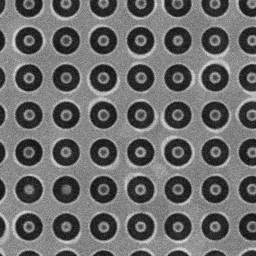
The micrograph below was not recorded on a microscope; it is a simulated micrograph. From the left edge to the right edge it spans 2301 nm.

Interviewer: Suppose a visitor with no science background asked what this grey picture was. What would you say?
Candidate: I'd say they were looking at an array of small figures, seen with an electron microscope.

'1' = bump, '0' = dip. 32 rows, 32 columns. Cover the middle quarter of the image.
00011111000011111000011111100011
00001110000001110000001111000001
10001100011001110001000110001000
11001100011000110011000110011100
10001100011000110000000110001000
00001110000001110000001111000001
00011111000011111000011111100011
11111111111111111111111111111111
11111111111111111111111111111111
00111111000011111100011111100011
00011110000001111000001111000001
00001100000001110000000110000000
11001100011001110011100110011100
11001110011001110011000110001000
00001110000001110000000110000000
00011111000011111000001111000001
11111111111111111110111111111111
11111111111111111111111111111111
01111111111111111110111111100111
00011111000011111000001110000001
00001110000001110000001110000000
10001100011001110011000110011100
10001100011000110011000110011100
00001110000001110000001110000000
00011110000001110000001111000001
01111111100011111100111111100011
11111111111111111111111111111111
11111111111111111111111111111111
00011111000011110000011111100001
00001110000001110000001111000000
00001110011001110001000110001000
10001100011000110011000110011100